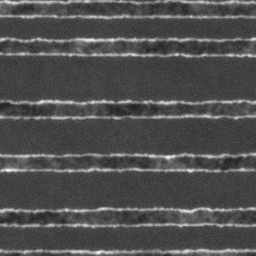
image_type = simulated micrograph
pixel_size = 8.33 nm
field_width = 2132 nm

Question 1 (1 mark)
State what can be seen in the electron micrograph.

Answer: lines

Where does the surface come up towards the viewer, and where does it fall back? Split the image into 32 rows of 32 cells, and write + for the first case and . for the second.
++++++++++++++++++++++++++++++++
++++++++++++++++++++++++++++++++
................................
................................
................................
++++++++++++++++++++++++++++++++
++++++++++++++++++++++++++++++++
................................
................................
................................
................................
................................
................................
++++++++++++++++++++++++++++++++
++++++++++++++++++++++++++++++++
................................
................................
................................
................................
+++++++.++++++++++++.+++++.+++++
++++++++++++++++++++++++++++++++
................................
................................
................................
................................
................................
++++++++++++++++++++++++++++++++
++++++++++++++++++++++++++++++++
................................
................................
................................
+++++++++++...++++++++++++++++++